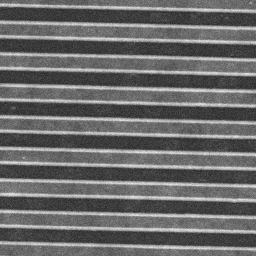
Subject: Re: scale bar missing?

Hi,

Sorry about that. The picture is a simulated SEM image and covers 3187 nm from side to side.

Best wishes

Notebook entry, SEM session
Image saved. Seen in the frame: parallel lines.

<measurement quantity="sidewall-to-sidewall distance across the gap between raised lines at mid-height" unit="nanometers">201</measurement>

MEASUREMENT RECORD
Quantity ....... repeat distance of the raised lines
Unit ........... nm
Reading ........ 393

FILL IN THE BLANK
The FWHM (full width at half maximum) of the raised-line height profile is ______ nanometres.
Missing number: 190